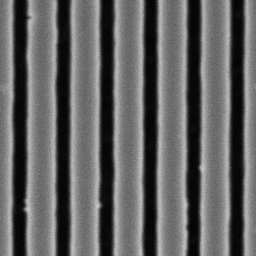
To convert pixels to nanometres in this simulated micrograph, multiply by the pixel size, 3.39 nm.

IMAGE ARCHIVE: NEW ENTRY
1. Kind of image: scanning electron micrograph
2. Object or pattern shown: parallel lines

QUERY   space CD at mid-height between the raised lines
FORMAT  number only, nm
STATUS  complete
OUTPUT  45.8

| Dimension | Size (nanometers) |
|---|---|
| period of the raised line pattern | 147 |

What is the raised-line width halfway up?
100 nanometers